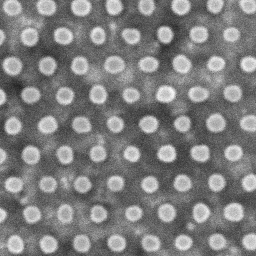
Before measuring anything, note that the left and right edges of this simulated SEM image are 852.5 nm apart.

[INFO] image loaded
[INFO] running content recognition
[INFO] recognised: a regular array of raised bodies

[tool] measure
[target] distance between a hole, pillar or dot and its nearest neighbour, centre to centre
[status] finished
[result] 0.11 um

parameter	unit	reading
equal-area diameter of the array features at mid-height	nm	52.4